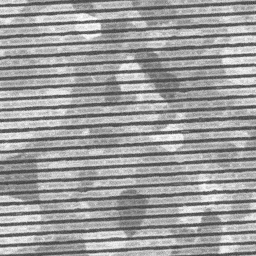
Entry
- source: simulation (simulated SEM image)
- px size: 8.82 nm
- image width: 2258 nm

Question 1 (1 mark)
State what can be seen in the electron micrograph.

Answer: parallel lines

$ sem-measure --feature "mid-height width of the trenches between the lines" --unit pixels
5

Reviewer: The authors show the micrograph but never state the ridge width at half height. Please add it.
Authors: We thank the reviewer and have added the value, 52.9 nm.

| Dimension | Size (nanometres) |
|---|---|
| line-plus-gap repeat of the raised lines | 92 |